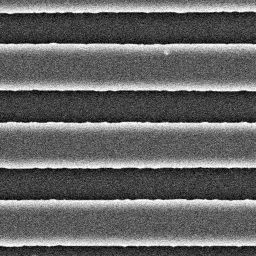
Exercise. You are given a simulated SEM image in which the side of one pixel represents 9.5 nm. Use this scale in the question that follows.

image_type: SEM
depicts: lines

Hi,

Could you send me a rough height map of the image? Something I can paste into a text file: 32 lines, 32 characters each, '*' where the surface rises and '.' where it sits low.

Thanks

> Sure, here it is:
********************************
********.***..*...*...*.........
................................
................................
................................
......*.........................
********************************
********************************
********************************
********************************
********************************
................................
................................
................................
................................
********************************
********************************
********************************
********************************
********************************
********************************
................................
................................
................................
................................
********************************
********************************
********************************
********************************
********************************
********************************
................................